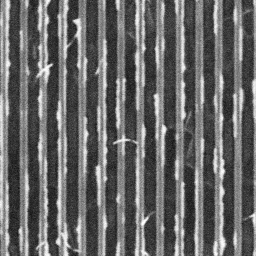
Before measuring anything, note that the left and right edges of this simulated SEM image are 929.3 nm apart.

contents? parallel lines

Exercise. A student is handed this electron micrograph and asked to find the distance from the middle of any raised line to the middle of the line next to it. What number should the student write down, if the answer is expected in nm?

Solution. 70.5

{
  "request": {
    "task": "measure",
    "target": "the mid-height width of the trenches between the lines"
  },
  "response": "0.0435 um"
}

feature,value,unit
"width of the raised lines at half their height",28.1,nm